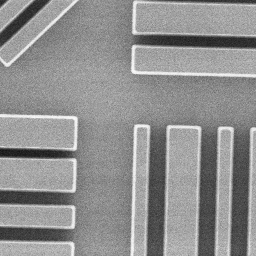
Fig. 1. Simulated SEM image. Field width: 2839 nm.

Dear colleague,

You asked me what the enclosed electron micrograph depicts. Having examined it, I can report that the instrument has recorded groups of lines, slits or small figures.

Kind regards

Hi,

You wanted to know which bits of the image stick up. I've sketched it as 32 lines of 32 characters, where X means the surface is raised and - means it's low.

-XXX--XXX--------XXXXXXXXXXXXX--
XXX--XXX---------XXXXXXXXXXXXXXX
XX--XXX----------XXXXXXXXXXXXXXX
X--XXX-----------XXXXXXXXXXXXXXX
--XXX------------------------XXX
-XXX----------------------------
XXX--------------XXXXXXXXXXXXXXX
XX---------------XXXXXXXXXXXXXXX
-----------------XXXXXXXXXXXXXXX
--------------------------------
--------------------------------
--------------------------------
--------------------------------
--------------------------------
XX------------------------------
XXXXXXXXXX----------------------
XXXXXXXXXX-------XX--XXXX--XX--X
XXXXXXXXX--------XX--XXXX--XX--X
--XXXXXXX--------XX--XXXX--XX--X
-----------------XX--XXXX--XX--X
XXXXXXXXX--------XX--XXXX--XX--X
XXXXXXXXX--------XX--XXXX--XX--X
XXXXXXXXX--------X---XXXX--XX--X
XXXXXXXXX--------X---XXXX--XX--X
-----------------X---XXXX--XX--X
-----------------X---XXXX--XX--X
XXXXXXXXX--------X---XXXX--XX--X
XXXXXXXXX--------X---XXXX--XX--X
-----------------X---XXXX--XX--X
-----------------X---XXXX--XX--X
XXXXXXXXX--------X---XXXX--XX--X
XXXXXXXXX--------X---XXXX--XX--X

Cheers